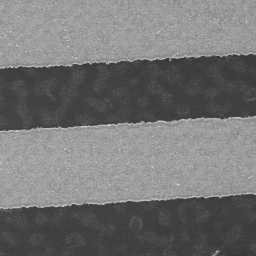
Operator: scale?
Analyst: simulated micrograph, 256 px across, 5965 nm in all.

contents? one or a few lines or trenches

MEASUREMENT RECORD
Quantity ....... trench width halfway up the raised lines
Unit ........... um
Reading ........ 1.46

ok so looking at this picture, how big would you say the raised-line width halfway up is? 1.81 um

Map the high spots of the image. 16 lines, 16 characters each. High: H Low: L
HHHHHHHHHHHHHHHH
HHHHHHHHHHHHHHHH
HHHHHHHHHHHHHHHH
HHHHHHHHHHHHHLLL
LLLLLLLLLLLLLLLL
LLLLLLLLLLLLLLLL
LLLLLLLLLLLLLLLL
LLLLLLLLLLLLHHHH
HHHHHHHHHHHHHHHH
HHHHHHHHHHHHHHHH
HHHHHHHHHHHHHHHH
HHHHHHHHHHHHHHHH
HHHHHHHHHLLLLLLL
LLLLLLLLLLLLLLLL
LLLLLLLLLLLLLLLL
LLLLLLLLLLLLLLLL